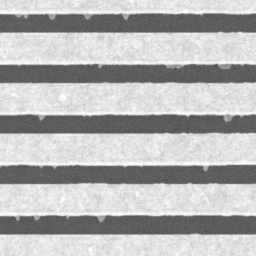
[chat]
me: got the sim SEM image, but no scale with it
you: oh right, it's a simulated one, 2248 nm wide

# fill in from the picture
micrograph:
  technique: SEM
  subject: lines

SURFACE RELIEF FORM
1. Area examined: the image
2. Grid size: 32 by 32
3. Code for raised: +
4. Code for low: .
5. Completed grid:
++++++++++++++++++++++++++++++++
++++++++++++++++++++++++++++++++
................................
................................
++++++++++++++++++++++++++++++++
++++++++++++++++++++++++++++++++
++++++++++++++++++++++++++++++++
++++++++++++++++++++++++++++++++
................................
................................
++++++++++++++++++++++++++++++++
++++++++++++++++++++++++++++++++
++++++++++++++++++++++++++++++++
++++++++++++++++++++++++++++++++
................................
................................
................................
++++++++++++++++++++++++++++++++
++++++++++++++++++++++++++++++++
++++++++++++++++++++++++++++++++
++++++++++++++++++++++++++++++++
................................
................................
++++++++++++++++++++++++++++++++
++++++++++++++++++++++++++++++++
++++++++++++++++++++++++++++++++
++++++++++++++++++++++++++++++++
................................
................................
++++++++++++++++++++++++++++++++
++++++++++++++++++++++++++++++++
++++++++++++++++++++++++++++++++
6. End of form